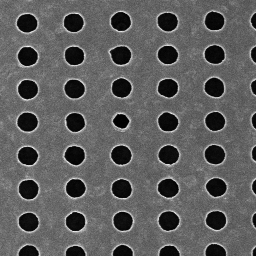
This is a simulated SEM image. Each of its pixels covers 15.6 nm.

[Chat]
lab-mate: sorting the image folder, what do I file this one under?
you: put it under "a regular array of holes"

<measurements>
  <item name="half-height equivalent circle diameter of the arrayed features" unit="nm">305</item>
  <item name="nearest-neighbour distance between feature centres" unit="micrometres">0.513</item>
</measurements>